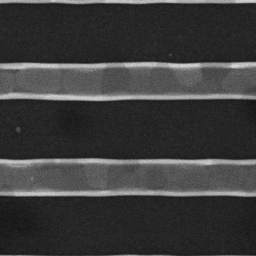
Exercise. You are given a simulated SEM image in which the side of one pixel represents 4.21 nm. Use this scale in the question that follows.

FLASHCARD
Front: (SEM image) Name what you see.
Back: wiring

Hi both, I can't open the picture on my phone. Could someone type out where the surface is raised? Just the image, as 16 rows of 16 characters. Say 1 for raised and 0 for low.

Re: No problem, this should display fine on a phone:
0000000000000000
0000000000000000
0000000000000000
0000000000000000
1111111111111111
1111111111111111
0000000000000000
0000000000000000
0000000000000000
0000000000000000
1111111111111111
1111111111111111
0000000000000000
0000000000000000
0000000000000000
0000000000000000